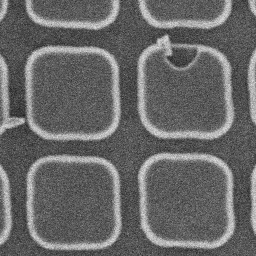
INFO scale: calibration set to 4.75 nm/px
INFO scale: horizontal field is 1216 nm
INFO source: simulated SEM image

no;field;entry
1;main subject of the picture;raised bodies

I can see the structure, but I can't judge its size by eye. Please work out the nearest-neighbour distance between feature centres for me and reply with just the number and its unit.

0.515 micrometres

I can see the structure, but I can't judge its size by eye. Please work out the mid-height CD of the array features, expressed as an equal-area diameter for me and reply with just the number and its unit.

464 nm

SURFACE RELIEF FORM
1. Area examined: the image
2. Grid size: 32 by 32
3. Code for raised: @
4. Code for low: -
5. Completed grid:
@--@@@@@@@@@@@----@@@@@@@@@@@--@
@---@@@@@@@@@@----@@@@@@@@@@----
-----@@@@@@@@@-----@@@@@@@@@----
--------------------------------
--------------------------------
--------------------@-----------
-----@@@@@@@@-----@@@----@@-----
----@@@@@@@@@@----@@@---@@@@----
@---@@@@@@@@@@@---@@@@@@@@@@---@
@---@@@@@@@@@@@---@@@@@@@@@@---@
@---@@@@@@@@@@@---@@@@@@@@@@@--@
@--@@@@@@@@@@@@---@@@@@@@@@@@---
@--@@@@@@@@@@@@---@@@@@@@@@@@---
@---@@@@@@@@@@@---@@@@@@@@@@@---
@---@@@@@@@@@@@---@@@@@@@@@@@---
@@@-@@@@@@@@@@----@@@@@@@@@@@---
-----@@@@@@@@@-----@@@@@@@@@----
--------------------------------
--------------------------------
--------------------@@@---------
----@@@@@@@@@@----@@@@@@@@@@----
----@@@@@@@@@@----@@@@@@@@@@@---
@---@@@@@@@@@@@---@@@@@@@@@@@---
@---@@@@@@@@@@@---@@@@@@@@@@@---
@---@@@@@@@@@@@---@@@@@@@@@@@---
@---@@@@@@@@@@@---@@@@@@@@@@@---
@---@@@@@@@@@@@---@@@@@@@@@@@---
@---@@@@@@@@@@@---@@@@@@@@@@@---
@---@@@@@@@@@@@---@@@@@@@@@@@---
@---@@@@@@@@@@@----@@@@@@@@@@---
-----@@@@@@@@-------@@@@@@@-----
--------------------------------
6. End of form